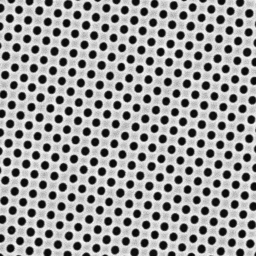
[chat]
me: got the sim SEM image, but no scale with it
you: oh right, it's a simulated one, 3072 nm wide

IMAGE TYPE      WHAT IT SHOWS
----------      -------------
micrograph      a regular array of holes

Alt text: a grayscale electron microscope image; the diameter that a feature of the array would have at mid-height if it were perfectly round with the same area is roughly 102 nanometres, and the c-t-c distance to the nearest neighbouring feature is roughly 157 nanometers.